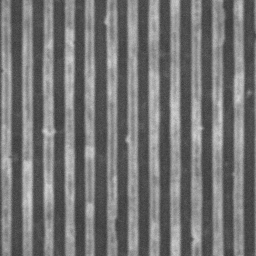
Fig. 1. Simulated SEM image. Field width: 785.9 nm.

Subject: parallel lines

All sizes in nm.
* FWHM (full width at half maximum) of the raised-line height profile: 21.5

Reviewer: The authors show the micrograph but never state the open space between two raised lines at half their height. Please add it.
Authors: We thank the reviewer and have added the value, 42.6 nanometres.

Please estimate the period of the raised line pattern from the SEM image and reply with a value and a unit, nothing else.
64.9 nm